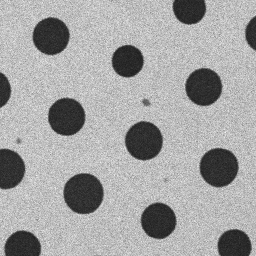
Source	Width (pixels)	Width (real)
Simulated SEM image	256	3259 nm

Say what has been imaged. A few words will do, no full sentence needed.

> a regular array of holes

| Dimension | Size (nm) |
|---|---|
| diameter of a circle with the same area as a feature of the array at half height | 480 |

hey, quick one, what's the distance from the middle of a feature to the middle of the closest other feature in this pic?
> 1020 nanometres